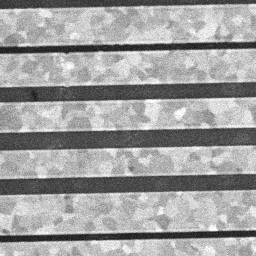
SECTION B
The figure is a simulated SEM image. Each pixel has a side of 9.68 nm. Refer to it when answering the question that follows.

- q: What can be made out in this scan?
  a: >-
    parallel lines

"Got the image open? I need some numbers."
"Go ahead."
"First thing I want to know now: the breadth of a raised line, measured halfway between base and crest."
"321 nm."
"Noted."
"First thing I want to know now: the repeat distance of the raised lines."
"454 nm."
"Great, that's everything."